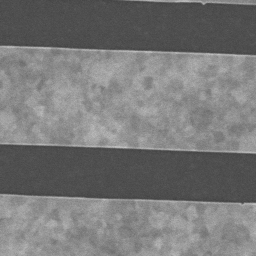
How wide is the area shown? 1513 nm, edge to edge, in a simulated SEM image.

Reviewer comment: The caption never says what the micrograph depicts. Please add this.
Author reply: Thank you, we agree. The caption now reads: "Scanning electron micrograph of one or a few lines or trenches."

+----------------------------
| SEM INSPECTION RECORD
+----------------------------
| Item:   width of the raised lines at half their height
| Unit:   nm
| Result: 574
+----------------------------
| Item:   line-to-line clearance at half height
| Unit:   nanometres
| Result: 300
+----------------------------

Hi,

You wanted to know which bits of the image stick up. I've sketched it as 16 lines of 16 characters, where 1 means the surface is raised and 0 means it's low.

0000000000000000
0000000000000000
0000000000000000
1111111111111111
1111111111111111
1111111111111111
1111111111111111
1111111111111111
1111111111111111
0000000000000001
0000000000000000
0000000000000000
1111111110000000
1111111111111111
1111111111111111
1111111111111111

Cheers